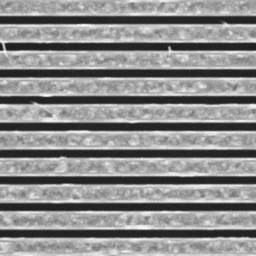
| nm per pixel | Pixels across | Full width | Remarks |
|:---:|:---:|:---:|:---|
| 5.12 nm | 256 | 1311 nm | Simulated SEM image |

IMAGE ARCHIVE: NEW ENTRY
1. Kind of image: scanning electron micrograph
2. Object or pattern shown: parallel lines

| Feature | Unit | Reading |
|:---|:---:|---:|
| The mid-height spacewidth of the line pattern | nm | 39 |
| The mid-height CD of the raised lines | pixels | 18.6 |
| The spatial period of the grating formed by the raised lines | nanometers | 137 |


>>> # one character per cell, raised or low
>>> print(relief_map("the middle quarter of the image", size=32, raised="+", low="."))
++++++++++++++++++++++++++++++++
................................
................................
++++++++++++++++++++++++++++++++
++++++++++++++++++++++++++++++++
++++++++++++++++++++++++++++++++
++++++++++++++++++++++++++++++++
++++++++++++++++++++++++++++++++
................................
................................
++++++++++++++++++++++++++++++++
++++++++++++++++++++++++++++++++
++++++++++++++++++++++++++++++++
++++++++++++++++++++++++++++++++
++++++++++++++++++++++++++++++++
................................
................................
++++++++++++++++++++++++++++++++
++++++++++++++++++++++++++++++++
++++++++++++++++++++++++++++++++
++++++++++++++++++++++++++++++++
................................
................................
++++++++++++++++++++++++++++++++
++++++++++++++++++++++++++++++++
++++++++++++++++++++++++++++++++
++++++++++++++++++++++++++++++++
++++++++++++++++++++++++++++++++
................................
................................
++++++++++++++++++++++++++++++++
++++++++++++++++++++++++++++++++